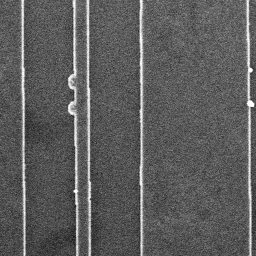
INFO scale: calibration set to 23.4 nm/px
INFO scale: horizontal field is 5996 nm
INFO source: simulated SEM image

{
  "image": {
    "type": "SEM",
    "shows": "lines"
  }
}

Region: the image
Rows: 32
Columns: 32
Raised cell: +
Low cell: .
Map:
+++......++.......+++++++++++++.
+++......++.......+++++++++++++.
+++......++.......+++++++++++++.
+++......++.......+++++++++++++.
+++......++.......+++++++++++++.
+++......++.......+++++++++++++.
+++......++.......+++++++++++++.
+++......++.......+++++++++++++.
+++......++.......+++++++++++++.
+++......++.......+++++++++++++.
+++......++.......+++++++++++++.
+++......++.......+++++++++++++.
+++......++.......+++++++++++++.
+++......++.......+++++++++++++.
+++......++.......+++++++++++++.
+++......++.......+++++++++++++.
+++......++.......+++++++++++++.
+++......++.......+++++++++++++.
+++......++.......+++++++++++++.
+++......++.......+++++++++++++.
+++......++.......+++++++++++++.
+++......++.......+++++++++++++.
+++......++.......+++++++++++++.
+++......++.......+++++++++++++.
+++......++.......+++++++++++++.
+++......++.......+++++++++++++.
+++.......+.......+++++++++++++.
+++.......+.......+++++++++++++.
+++.......+.......+++++++++++++.
+++.......+.......+++++++++++++.
+++.......+.......+++++++++++++.
+++.......+.......+++++++++++++.